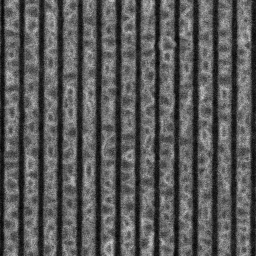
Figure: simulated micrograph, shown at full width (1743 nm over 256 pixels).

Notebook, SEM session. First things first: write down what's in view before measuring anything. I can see parallel lines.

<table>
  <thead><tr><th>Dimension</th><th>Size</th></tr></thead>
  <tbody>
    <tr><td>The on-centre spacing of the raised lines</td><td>19.4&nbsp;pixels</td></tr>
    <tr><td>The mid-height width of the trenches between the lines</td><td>40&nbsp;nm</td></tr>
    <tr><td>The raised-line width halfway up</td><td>93.7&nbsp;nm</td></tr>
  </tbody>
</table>